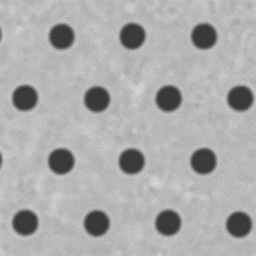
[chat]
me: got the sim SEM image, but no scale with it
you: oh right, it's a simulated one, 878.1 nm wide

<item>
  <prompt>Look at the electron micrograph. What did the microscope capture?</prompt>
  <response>a regular array of holes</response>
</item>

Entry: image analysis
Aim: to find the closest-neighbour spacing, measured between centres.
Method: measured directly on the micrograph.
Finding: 0.243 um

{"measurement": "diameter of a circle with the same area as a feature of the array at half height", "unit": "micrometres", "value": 0.0923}